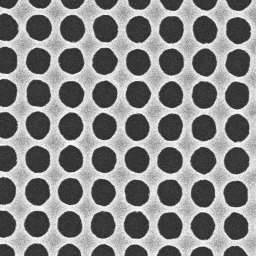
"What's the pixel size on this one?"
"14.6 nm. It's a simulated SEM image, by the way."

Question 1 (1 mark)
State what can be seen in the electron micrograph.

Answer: a regular array of holes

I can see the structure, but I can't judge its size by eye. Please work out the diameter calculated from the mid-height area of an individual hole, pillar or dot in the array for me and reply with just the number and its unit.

0.388 um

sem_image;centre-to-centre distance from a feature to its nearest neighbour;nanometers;473